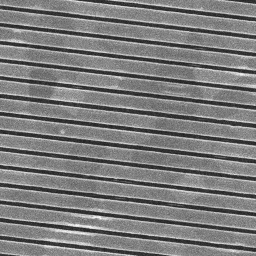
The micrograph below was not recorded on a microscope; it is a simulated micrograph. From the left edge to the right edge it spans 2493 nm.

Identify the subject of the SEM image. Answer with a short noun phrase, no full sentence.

parallel lines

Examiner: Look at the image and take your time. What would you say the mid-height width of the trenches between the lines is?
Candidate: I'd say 42.3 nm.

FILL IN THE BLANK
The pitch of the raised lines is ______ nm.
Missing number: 172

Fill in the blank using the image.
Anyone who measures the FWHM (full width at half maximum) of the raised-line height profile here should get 0.127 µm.